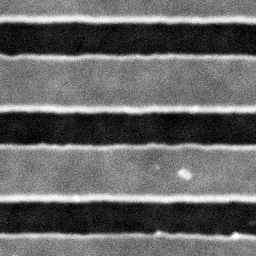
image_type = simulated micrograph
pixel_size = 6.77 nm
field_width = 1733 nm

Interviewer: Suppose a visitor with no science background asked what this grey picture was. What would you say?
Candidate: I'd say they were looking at lines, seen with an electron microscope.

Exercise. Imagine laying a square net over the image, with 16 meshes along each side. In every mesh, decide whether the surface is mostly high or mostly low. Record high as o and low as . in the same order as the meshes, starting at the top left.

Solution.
oooooooooooooooo
................
................
.oo..oo.oooo....
oooooooooooooooo
oooooooooooooooo
oooooooooooooooo
................
................
oooooooooooooooo
oooooooooooooooo
oooooooooooooooo
oooooo.ooooooooo
................
................
oooooooooooooooo